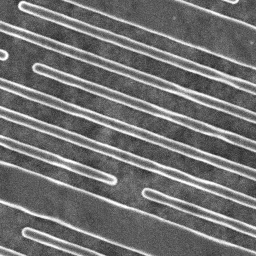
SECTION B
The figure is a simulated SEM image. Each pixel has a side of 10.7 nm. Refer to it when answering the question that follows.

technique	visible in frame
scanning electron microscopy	groups of lines, slits or small figures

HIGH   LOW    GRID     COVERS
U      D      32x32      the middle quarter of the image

DDDDDDDDUUUUUUUDDDDDDDDDDDDDUUUU
DDDDDDDDDDDUUUUUUUDDDDDDDDDDDDUU
UDDDDDDDDDDDDDUUUUUUUDDDDDDDDDDD
UUUUDDDDDDDDDDDDDUUUUUUUDDDDDDDD
UUUUUUUDDDDDDDDDDDDUUUUUUUDDDDDD
DDDUUUUUUDDDDDDDDDDDDDUUUUUUDDDD
DDDDDUUUUUUUDDDDDDDDDDDDDUUUUUUD
DDDDDDDDUUUUUUDDDDDDDDDDDDDDUUUU
DDDDDDDDDDDUUUUUUUDDDDDDDDDDDDDU
DDDDDDDDDDDDDUUUUUUUUDDDDDDDDDDD
UUUDDDDDDDDDDDDDUUUUUUUDDDDDDDDD
UUUUUUDDDDDDDDDDDDDUUUUUUDDDDDDD
DDUUUUUUDDDDDDDDDDDDDDUUUUUUDDDD
DDDDDDUUUUUUDDDDDDDDDDDDDUUUUUUU
DDDDDDDDUUUUUUDDDDDDDDDDDDDDUUUU
DDDDDDDDDDDUUUUUUDDDDDDDDDDDDDUU
DDDDDDDDDDDDDUUUUUUUDDDDDDDDDDDD
UUUDDDDDDDDDDDDDUUUUUUUDDDDDDDDD
UUUUUUDDDDDDDDDDDDDUUUUUUUDDDDDD
DDUUUUUUDDDDDDDDDDDDDDUUUUUUUDDD
DDDDUUUUUUUDDDDDDDDDDDDDUUUUUUUD
DDDDDDDUUUUUUUDDDDDDDDDDDDDUUUUU
DDDDDDDDDDUUUUUUUDDDDDDDDDDDDUUU
DDDDDDDDDDDDDUUUUUUDDDDDDDDDDDDD
UUUDDDDDDDDDDDDDUUUUUUUDDDDDDDDD
UUUUUUDDDDDDDDDDDDUUUUUUUDDDDDDD
DDUUUUUUDDDDDDDDDDDDDUUUUUUUDDDD
DDDDUUUUUUDDDDDDDDDDDDDDUUUUUUDD
DDDDDDDUUUUUUDDDDDDDDDDDDDDUUUUU
DDDDDDDDDDDUUDDDDDDDDDDDDDDDDDUU
UUDDDDDDDDDDDDDDDDDDDDDDDDDDDDDD
UUUUUDDDDDDDDDDDDDDDUUDDDDDDDDDD